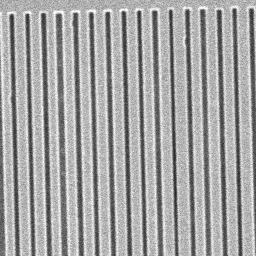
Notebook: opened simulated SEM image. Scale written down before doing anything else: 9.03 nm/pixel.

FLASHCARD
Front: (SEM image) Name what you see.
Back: parallel lines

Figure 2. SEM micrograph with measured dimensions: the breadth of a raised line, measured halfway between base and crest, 95.9 nanometers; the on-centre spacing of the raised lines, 0.143 µm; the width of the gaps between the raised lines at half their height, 48.5 nanometers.